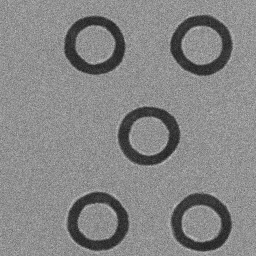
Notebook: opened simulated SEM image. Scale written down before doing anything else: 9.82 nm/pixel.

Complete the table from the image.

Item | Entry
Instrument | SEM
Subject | ring-shaped grooves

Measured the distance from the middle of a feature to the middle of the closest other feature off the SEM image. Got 102 px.